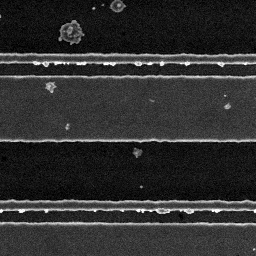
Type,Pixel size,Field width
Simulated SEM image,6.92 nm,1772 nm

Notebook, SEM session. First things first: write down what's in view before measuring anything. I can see lines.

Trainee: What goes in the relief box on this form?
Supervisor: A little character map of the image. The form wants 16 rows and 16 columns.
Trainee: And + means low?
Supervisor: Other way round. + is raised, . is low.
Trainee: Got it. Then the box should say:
................
................
................
++++++++++++++++
++++++++++++++++
++++++++++++++++
++++++++++++++++
++++++++++++++++
++++++++++++++++
................
................
................
................
++++++++++++++++
++++++++++++++++
++++++++++++++++